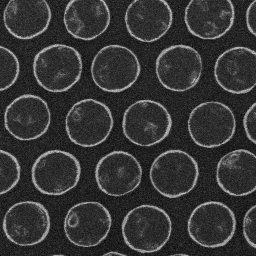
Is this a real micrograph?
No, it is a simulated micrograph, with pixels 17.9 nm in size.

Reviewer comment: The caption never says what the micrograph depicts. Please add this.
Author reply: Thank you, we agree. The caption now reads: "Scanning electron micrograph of a regular array of raised bodies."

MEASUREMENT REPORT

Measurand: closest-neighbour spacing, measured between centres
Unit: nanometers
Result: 1050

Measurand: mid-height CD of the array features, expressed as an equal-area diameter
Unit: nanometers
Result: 819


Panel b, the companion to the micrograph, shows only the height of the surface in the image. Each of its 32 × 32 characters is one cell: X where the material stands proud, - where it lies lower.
-XXXXX---XXXX---XXXXX---XXXXX---
-XXXXX--XXXXXX--XXXXX--XXXXXX--X
-XXXXX--XXXXXX--XXXXX--XXXXXX--X
-XXXXX--XXXXX---XXXXX---XXXXX--X
--XX-----XXX-----XXX-----XXX----
--------------------------------
X----XXXX---XXXX----XXXXX---XXXX
XX--XXXXXX--XXXXX---XXXXX--XXXXX
XX--XXXXXX-XXXXXX---XXXXX--XXXXX
XX--XXXXXX--XXXXX---XXXXX--XXXXX
XX---XXXX---XXXX----XXXX----XXXX
-----------------------------X--
--XXX---------------------------
-XXXXX---XXXX---XXXX-----XXX---X
-XXXXX--XXXXXX--XXXXX---XXXXX--X
-XXXXX--XXXXXX--XXXXX---XXXXX--X
-XXXX----XXXXX--XXXXX---XXXXX--X
---------XXXX---XXXX----XXXXX---
--------------------------------
X----XXXX----XXX----XXXX----XXXX
XX--XXXXXX--XXXXX--XXXXX---XXXXX
XX--XXXXXX--XXXXXX-XXXXXX--XXXXX
XX--XXXXXX--XXXXXX-XXXXX---XXXXX
X----XXXX----XXXX--XXXXX----XXXX
---------------------X----------
--XXX-----XX-------------XXX----
-XXXXX---XXXX---XXXX----XXXXX--X
-XXXXX--XXXXXX--XXXXX---XXXXX-XX
-XXXXX--XXXXXX-XXXXXX---XXXXX-XX
-XXXXX--XXXXX--XXXXXX---XXXXX--X
--XX------XX----XXXXX----XXX---X
--------------------------------